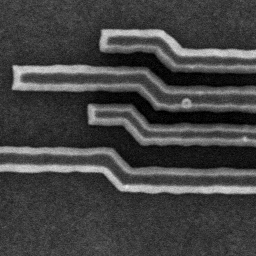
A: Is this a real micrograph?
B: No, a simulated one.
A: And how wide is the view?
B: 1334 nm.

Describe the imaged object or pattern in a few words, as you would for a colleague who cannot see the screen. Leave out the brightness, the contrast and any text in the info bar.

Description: groups of lines, slits or small figures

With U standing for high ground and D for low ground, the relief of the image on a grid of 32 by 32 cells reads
DDDDDDDDDDDDDDDDDDDDDDDDDDDDDDDD
DDDDDDDDDDDDDDDDDDDDDDDDDDDDDDDD
DDDDDDDDDDDDDDDDDDDDDDDDDDDDDDDD
DDDDDDDDDDDDDDDDDDDDDDDDDDDDDDDD
DDDDDDDDDDDDDUUUUUUUUDDDDDDDDDDD
DDDDDDDDDDDDDUUUUUUUUUDDDDDDDDDD
DDDDDDDDDDDDDDDDDDDDUUUDDDDDDDDD
DDDDDDDDDDDDDDDDDDDDUUUUUUUUUUUU
DDDDDDDDDDDDDDDDDDDDDDUUUUUUUUUU
DDUUUUUUUUUUUUUUUUUDDDDDDDDDDDDD
DDUUUUUUUUUUUUUUUUUUDDDDDDDDDDDD
DDDDDDDDDDDDDDDDDDUUUUUUUUUUUUUU
DDDDDDDDDDDDDDDDDDDUUUUUUUUUUUUU
DDDDDDDDDDDUUUUUDDDDDUUDDDUUUUUU
DDDDDDDDDDDUUUUUUDDDDDDDDDDDDDDD
DDDDDDDDDDDDDDDDUUDDDDDDDDDDDDDD
DDDDDDDDDDDDDDDDDUUUUUUUUUUUUUUU
DDDDDDDDDDDDDDDDDUUUUUUUUUUUUUUU
DDDDDDDDDDDDDDDDDDDDDDDDDDDDDDDD
UUUUUUUUUUUUUUUDDDDDDDDDDDDDDDDD
UUUUUUUUUUUUUUUDDDDDDDDDDDDDDDDD
DDDDDDDDDDDDDUUUUUUUUUUUDDDUUDDD
DDDDDDDDDDDDDDUUUUUUUUUUUUUUUUUU
DDDDDDDDDDDDDDDDDDUUUUUUUUUUUUUU
DDDDDDDDDDDDDDDDDDDDDDDDDDDDDDDD
DDDDDDDDDDDDDDDDDDDDDDDDDDDDDDDD
DDDDDDDDDDDDDDDDDDDDDDDDDDDDDDDD
DDDDDDDDDDDDDDDDDDDDDDDDDDDDDDDD
DDDDDDDDDDDDDDDDDDDDDDDDDDDDDDDD
DDDDDDDDDDDDDDDDDDDDDDDDDDDDDDDD
DDDDDDDDDDDDDDDDDDDDDDDDDDDDDDDD
DDDDDDDDDDDDDDDDDDDDDDDDDDDDDDDD